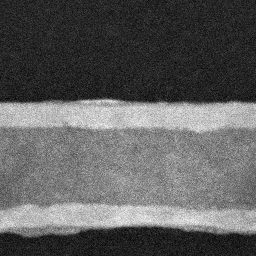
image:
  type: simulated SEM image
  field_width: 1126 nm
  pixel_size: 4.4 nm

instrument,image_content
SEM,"one or a few lines or trenches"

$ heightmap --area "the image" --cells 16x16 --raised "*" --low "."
................
................
................
................
................
................
................
****************
****************
****************
****************
****************
****************
****************
................
................